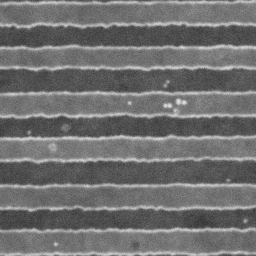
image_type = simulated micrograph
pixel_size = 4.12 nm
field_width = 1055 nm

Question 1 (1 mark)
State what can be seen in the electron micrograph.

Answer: lines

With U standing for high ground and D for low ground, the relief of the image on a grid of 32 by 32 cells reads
UUUUUUUUUUUUUUUUUUUUUUUUUUUUUUUU
UUUUUUUUUUUUUUUUUUUUUUUUUUUUUUUU
UUUUUUUUUUUUUUUUUUUUUUUUUUUUUUUU
DDDDDDDDDDDDDDDDDDDDDDDDDDDDDDDD
DDDDDDDDDDDDDDDDDDDDDDDDDDDDDDDD
DDDDDDDDDDDDDDDDDDDDDDDDDDDDDDDD
UUUUUUUUUUUUUUUUUUUUUUUUUUUUUUUU
UUUUUUUUUUUUUUUUUUUUUUUUUUUUUUUU
UUUUUUUUDDUUUUUUUUUUUUUUUDUUUDUU
DDDDDDDDDDDDDDDDDDDDDDDDDDDDDDDD
DDDDDDDDDDDDDDDDDDDDDDDDDDDDDDDD
DDDDDDDDDDDDDDDDDDDDDDDDDDDDDDDD
UUUUUUUUUUUUUUUUUUUUUUUUUUUUUUUU
UUUUUUUUUUUUUUUUUUUUUUUUUUUUUUUU
UUUUUUUDUUUUUDDDDUUDDUUUUUUDUUUU
DDDDDDDDDDDDDDDDDDDDDDDDDDDDDDDD
DDDDDDDDDDDDDDDDDDDDDDDDDDDDDDDD
UUUUUUUUUUUUUUUUUUUUUUUUUUUUUUUU
UUUUUUUUUUUUUUUUUUUUUUUUUUUUUUUU
UUUUUUUUUUUUUUUUUUUUUUUUUUUUUUUU
DDDDDDDDDDDDDDDDDDDDDDDDDDDDDDDD
DDDDDDDDDDDDDDDDDDDDDDDDDDDDDDDD
DDDDDDDDDDDDDDDDDDDDDDDDDDDDDDDD
UUUUUUUUUUUUUUUUUUUUUUUUUUUUUUUU
UUUUUUUUUUUUUUUUUUUUUUUUUUUUUUUU
UUUUUUUUUUUUUUUUUUUUUUUUUUUUUUUU
DDDDDDDDDDDDDDDDDDDDDDDDDDDDDDDD
DDDDDDDDDDDDDDDDDDDDDDDDDDDDDDDD
DDDDDDDDDDDDDDDDDDDDDDDDDDDDDDDD
UUUUUUUUUUUUUUUUUUUUUUUUUUUUUUUU
UUUUUUUUUUUUUUUUUUUUUUUUUUUUUUUU
UUUUUUUUUUUUUUUUUUUUUUUUUUUUUUUU